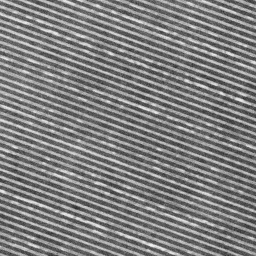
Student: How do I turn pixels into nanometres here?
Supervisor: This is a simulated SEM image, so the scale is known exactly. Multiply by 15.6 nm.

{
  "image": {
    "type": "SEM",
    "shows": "parallel lines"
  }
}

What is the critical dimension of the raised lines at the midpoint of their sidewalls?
36.7 nanometers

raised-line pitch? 104 nm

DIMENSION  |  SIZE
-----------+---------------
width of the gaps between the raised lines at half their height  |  73.4 nm